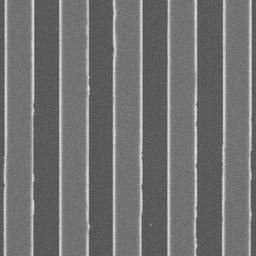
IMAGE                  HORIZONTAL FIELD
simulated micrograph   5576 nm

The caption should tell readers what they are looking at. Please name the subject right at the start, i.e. lines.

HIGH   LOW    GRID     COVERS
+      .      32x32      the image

.+++...++++...++++...++++...+++.
.+++...++++...++++...++++...+++.
.+++...++++...++++...++++...+++.
.+++....+++...++++...++++...+++.
.+++....+++...++++...++++...+++.
.+++....+++...++++...++++...+++.
.+++....+++...++++...++++...+++.
.+++...++++...++++...++++...+++.
.+++...++++...++++...++++...+++.
.+++...++++...++++...++++...+++.
.+++...++++...++++...++++...+++.
.+++...++++...++++...++++...+++.
.+++...++++...++++...++++...+++.
.+++...++++...++++...++++...+++.
.+++...++++...++++...++++...+++.
.+++...++++...++++...+++....+++.
.+++...++++...++++...++++...+++.
.+++...++++...++++...++++...+++.
.+++...++++...++++...++++...+++.
.+++...++++...++++...++++...+++.
.+++...++++...++++...++++...+++.
.+++...++++...++++...++++...+++.
.+++...++++...++++...++++...+++.
.+++...++++...++++...++++...+++.
.+++...++++...++++...++++...+++.
.+++...++++...++++...++++...+++.
.+++...++++...++++...++++...+++.
.+++...++++...++++...+++....+++.
.+++...++++...++++...+++....+++.
.+++...++++...++++...+++....+++.
.+++...++++...++++...++++...+++.
.+++...++++...++++...+++....+++.